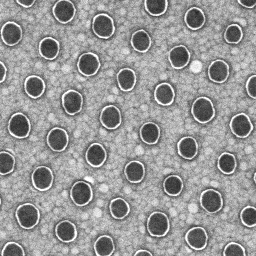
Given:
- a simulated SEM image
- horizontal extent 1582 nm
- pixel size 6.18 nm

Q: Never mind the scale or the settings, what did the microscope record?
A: a regular array of raised bodies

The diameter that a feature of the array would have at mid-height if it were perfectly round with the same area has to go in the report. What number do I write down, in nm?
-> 134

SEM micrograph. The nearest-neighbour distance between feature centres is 250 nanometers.